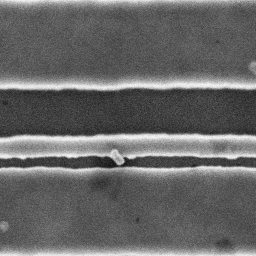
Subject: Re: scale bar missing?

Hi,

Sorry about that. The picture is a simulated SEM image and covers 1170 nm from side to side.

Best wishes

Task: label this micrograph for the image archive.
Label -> lines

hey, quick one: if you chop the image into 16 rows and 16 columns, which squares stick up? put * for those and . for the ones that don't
****************
****************
****************
****************
****************
......*.........
................
................
................
****************
****************
****************
****************
****************
****************
****************